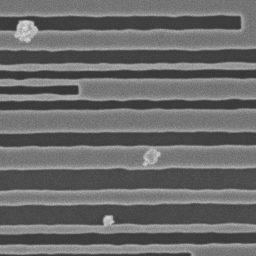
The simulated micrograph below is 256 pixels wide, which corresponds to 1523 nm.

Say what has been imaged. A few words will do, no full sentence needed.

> groups of lines, slits or small figures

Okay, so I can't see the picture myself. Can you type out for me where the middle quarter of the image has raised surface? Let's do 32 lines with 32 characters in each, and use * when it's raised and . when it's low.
********************************
***************.*****........***
................................
................................
********************************
...*****************************
....****************************
...*****************************
********************************
................................
................................
********************************
********************************
********************************
********************************
********************************
********************************
................................
................................
................................
...***......***..*****....******
********************************
********************************
********************************
********************************
********************************
................................
................................
................................
................................
................................
..........******.***************